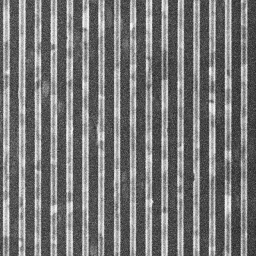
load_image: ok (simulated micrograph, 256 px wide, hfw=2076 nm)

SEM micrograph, parallel lines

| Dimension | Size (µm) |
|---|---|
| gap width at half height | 0.0881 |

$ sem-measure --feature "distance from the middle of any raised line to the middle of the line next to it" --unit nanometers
129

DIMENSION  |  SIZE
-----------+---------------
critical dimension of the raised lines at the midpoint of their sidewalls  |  40.5 nanometres